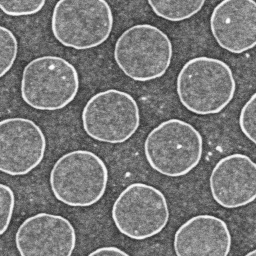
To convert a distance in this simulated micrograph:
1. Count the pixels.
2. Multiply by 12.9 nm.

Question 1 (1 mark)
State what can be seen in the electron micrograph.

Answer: raised bodies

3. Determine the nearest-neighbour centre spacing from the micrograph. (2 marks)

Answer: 899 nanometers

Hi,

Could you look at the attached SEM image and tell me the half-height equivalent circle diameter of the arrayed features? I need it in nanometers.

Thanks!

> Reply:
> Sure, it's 706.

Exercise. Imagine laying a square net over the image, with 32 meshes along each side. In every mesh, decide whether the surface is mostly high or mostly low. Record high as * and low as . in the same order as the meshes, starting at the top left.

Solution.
*****..******......******...****
.***...*******......****...*****
.......*******............******
.......*******..***........*****
**.....******..******......*****
**......****...******.......****
**............*******........*..
**...***.......******...***.....
*..******......******..*****....
...*******......****..*******...
...*******............*******...
...******....**.......*******...
...******..******......******..*
.....**....******.......****..**
..........*******.............**
****.......******...***.......**
*****......******..******......*
*****........***..*******.......
*****.............*******.......
*****...****......*******....*..
*****..******......*****...*****
.**....******.......***....*****
......*******.............******
*......******...***.......******
**.....******..*****.......*****
**.......**...*******.......**..
*.............*******...........
*..*****......*******...***.....
*..******......*****...*****....
..*******.......***...*******...
..*******.............*******...
...******...***.......******....